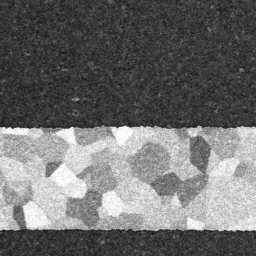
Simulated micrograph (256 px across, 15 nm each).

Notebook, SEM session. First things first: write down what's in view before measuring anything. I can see one or a few lines or trenches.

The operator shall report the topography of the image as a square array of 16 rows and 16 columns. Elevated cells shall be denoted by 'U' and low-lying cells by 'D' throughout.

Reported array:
DDDDDDDDDDDDDDDD
DDDDDDDDDDDDDDDD
DDDDDDDDDDDDDDDD
DDDDDDDDDDDDDDDD
DDDDDDDDDDDDDDDD
DDDDDDDDDDDDDDDD
DDDDDDDDDDDDDDDD
DDDDDDDDDDDDDDDD
UUUUUUUUUUUUUUUU
UUUUUUUUUUUUUUUU
UUUUUUUUUUUUUUUU
UUUUUUUUUUUUUUUU
UUUUUUUUUUUUUUUU
UUUUUUUUUUUUUUUU
DDDDDDDDDDDDDDDD
DDDDDDDDDDDDDDDD